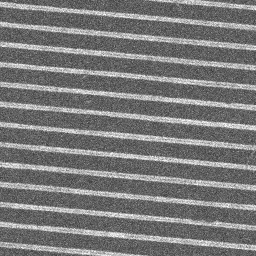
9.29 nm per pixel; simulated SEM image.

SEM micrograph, parallel lines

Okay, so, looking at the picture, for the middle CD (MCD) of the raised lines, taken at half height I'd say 3.61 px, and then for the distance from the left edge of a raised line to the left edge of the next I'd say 185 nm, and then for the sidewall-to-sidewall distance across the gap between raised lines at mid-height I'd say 149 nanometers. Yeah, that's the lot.